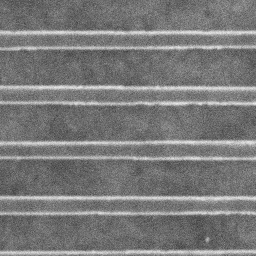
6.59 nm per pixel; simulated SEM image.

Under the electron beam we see lines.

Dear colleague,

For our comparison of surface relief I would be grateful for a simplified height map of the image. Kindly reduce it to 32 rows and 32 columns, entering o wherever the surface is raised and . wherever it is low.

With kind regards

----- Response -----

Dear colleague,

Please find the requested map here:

................................
................................
................................
................................
oooooooooooooooooooooooooooooooo
oooooooooooooooooooooooooooooooo
................................
................................
................................
................................
................................
oooooooooooooooooooooooooooooooo
oooooooooooooooooooooooooooooooo
................................
................................
................................
................................
................................
oooooooooooooooooooooooooooooooo
oooooooooooooooooooooooooooooooo
................................
................................
................................
................................
................................
oooooooooooooooooooooooooooooooo
oooooooooooooooooooooooooooooooo
................................
................................
................................
................................
................oo.o...o..oooooo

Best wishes